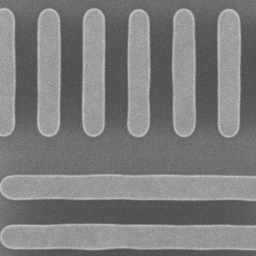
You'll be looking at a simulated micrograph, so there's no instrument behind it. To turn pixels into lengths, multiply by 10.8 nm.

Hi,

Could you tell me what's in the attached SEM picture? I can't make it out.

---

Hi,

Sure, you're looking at groups of lines, slits or small figures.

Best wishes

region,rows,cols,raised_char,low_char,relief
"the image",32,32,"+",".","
................................
+....++....++....+....++....+...
++...++...+++...+++...++...+++..
++...++...+++...+++...++...+++..
++...++...+++...+++...++...+++..
++...++...+++...+++...++...+++..
++...++...+++...+++...++...+++..
++...++...+++...+++...++...+++..
++...++...+++...+++...++...+++..
++...++...+++...+++...++...+++..
++...++...+++...+++...++...+++..
++...++...+++...+++...++...+++..
++...++...+++...+++...++...+++..
++...++...+++...+++...++...+++..
++...++...+++...+++...++...+++..
++...++...+++...+++...++...+++..
+....++....++...++....++....++..
................................
................................
................................
................................
................................
++++++++++++++++++++++++++++++++
++++++++++++++++++++++++++++++++
.+++++++++++++++++++++++++++++++
................................
................................
................................
.+++++++++++++++++++++++++++++++
++++++++++++++++++++++++++++++++
++++++++++++++++++++++++++++++++
................................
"